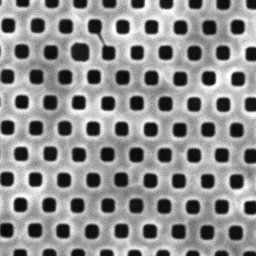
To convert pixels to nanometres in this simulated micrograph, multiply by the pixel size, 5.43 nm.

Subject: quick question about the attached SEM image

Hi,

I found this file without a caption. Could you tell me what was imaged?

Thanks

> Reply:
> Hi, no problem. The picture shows a regular array of holes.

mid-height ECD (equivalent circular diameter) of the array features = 86.8 nm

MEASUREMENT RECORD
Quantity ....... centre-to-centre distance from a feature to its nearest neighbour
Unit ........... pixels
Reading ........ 28.4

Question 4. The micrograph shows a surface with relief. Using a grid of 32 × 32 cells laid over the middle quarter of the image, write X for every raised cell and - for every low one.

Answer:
XXXXXXXXXXXXXXXXXXXXXXXXXXXXXXXX
-XXXXX--XXXXXX-XXXXXX-XXXXXXXXXX
--XXXX---XXXX----XXX----XXX----X
--XXXX---XXXX----XXX----XXX----X
--XXXX---XXXX---XXXX----XXX----X
XXXXXXXXXXXXXXXXXXXXX-XXXXXX--XX
XXXXXXXXXXXXXXXXXXXXXXXXXXXXXXXX
XXXXXXXXXXXXXXXXXXXXXXXXXXXXXXXX
XX---XXXX----XXXX---XXXX---XXXX-
XX----XXX----XXX----XXXX---XXXX-
XX----XXX----XXX----XXXX---XXXX-
XXX-XXXXXX---XXXX--XXXXX---XXXX-
XXXXXXXXXXXXXXXXXXXXXXXXXXXXXXXX
XXXXXXXXXXXXXXXXXXXXXXXXXXXXXXXX
--XXXX---XXXXX-XXXXXX--XXXXX--XX
--XXXX---XXX----XXXX----XXX----X
--XXX----XXX----XXXX----XXX----X
--XXXX---XXXX---XXXX---XXXX----X
XXXXXXXXXXXXXXXXXXXXXXXXXXXXXXXX
XXXXXXXXXXXXXXXXXXXXXXXXXXXXXXXX
XXXXXXXXXXXXXXXXXXXXXXXXXXXXXXXX
XX---XXXX----XXXX---XXXX---XXXX-
XX----XXX----XXX----XXX----XXXX-
XX----XXX----XXX----XXX----XXXX-
XXX--XXXXX--XXXXX--XXXXX--XXXXX-
XXXXXXXXXXXXXXXXXXXXXXXXXXXXXXXX
XXXXXXXXXXXXXXXXXXXXXXXXXXXXXXXX
--XXXX---XXXX---XXXX---XXXXX--XX
--XXX----XXX----XXXX---XXXX----X
--XXX----XXX----XXXX----XXX----X
--XXXX---XXXX---XXXX---XXXX---XX
XXXXXXXXXXXXXXXXXXXXXXXXXXXXXXXX